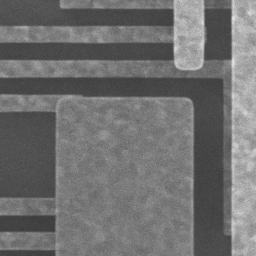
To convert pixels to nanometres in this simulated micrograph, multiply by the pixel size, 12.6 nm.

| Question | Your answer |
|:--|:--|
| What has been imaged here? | wiring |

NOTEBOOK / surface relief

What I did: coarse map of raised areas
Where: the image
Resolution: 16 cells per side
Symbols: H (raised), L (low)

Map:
LLLLLLLLLLLHHLLH
LLLLLLLLLLLHHLHH
LLLLLLLLLLLHHLLH
LLLLLLLLLLLHHLLH
LLLLLLLLLLLLLLLH
LLLLLLLLLLLLLLHH
LLLLHHHHHHHHLLLH
LLLLHHHHHHHHLLLH
LLLHHHHHHHHHLLLH
LLLHHHHHHHHHLLHH
LLLHHHHHHHHHLLHH
LLLHHHHHHHHHLLHH
LLLHHHHHHHHHLLHH
LLLHHHHHHHHHLLHH
LLLHHHHHHHHHLLHH
LLLHHHHHHHHHLLHH